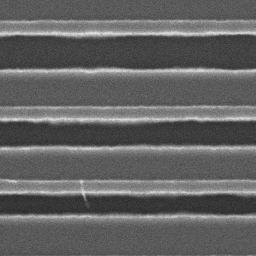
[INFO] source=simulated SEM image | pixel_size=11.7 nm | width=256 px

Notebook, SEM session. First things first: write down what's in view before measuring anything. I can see lines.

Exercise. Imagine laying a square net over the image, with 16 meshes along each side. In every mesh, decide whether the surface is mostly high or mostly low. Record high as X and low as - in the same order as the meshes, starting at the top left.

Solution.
XXXXXXXXXXXXXXXX
XXXXXXXXXXXXXXXX
----------------
----------------
XXXXXXXXXXXXXXXX
XXXXXXXXXXXXXXXX
XXXXXXXXXXXXXXXX
----------------
----------------
XXXXXXXXXXXXXXXX
XXXXXXXXXXXXXXXX
XXXXXXXXXXXXXXXX
----------------
----------------
XXXXXXXXXXXXXXXX
XXXXXXXXXXXXXXXX